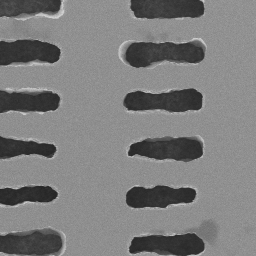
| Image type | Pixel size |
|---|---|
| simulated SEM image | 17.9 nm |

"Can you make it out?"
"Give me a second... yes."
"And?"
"holes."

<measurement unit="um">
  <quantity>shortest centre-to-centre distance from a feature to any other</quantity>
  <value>0.854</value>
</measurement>